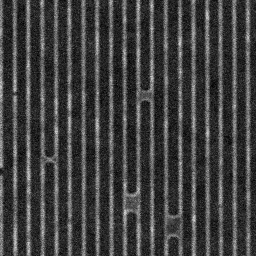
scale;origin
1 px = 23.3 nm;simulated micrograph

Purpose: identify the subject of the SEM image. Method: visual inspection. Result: parallel lines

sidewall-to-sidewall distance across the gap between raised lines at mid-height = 268 nm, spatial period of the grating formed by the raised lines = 320 nm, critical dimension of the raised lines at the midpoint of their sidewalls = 52.5 nanometers